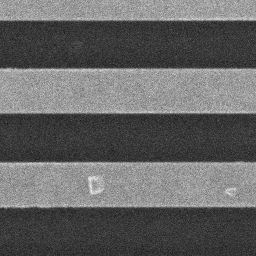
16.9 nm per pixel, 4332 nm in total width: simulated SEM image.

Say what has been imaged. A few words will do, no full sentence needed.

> lines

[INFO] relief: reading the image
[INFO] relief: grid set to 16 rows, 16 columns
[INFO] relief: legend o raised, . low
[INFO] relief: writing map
oooooooooooooooo
................
................
................
oooooooooooooooo
oooooooooooooooo
oooooooooooooooo
................
................
................
oooooooooooooooo
oooooooooooooooo
oooooooooooooooo
................
................
................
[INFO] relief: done